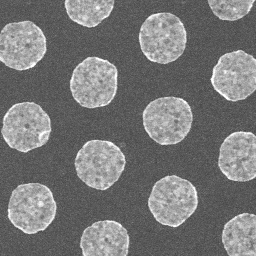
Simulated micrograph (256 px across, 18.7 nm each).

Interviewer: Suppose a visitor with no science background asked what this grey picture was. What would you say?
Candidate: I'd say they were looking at raised bodies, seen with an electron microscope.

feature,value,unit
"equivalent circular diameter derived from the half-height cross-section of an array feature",899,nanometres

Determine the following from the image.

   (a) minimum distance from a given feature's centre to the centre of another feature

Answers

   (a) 1510 nanometers